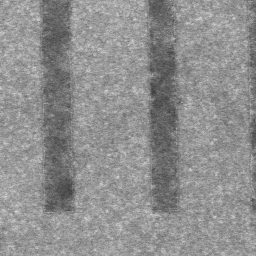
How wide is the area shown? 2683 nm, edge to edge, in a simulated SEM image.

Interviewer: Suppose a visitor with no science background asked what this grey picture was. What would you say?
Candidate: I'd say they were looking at one or a few lines or trenches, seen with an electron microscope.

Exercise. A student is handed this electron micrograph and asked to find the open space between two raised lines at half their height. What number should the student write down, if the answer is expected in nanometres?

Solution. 790